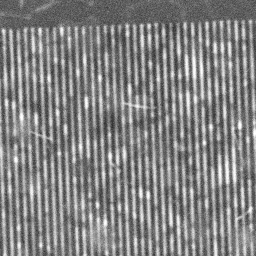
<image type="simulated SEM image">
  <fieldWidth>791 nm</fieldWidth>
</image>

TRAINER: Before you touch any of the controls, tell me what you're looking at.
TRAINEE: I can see parallel lines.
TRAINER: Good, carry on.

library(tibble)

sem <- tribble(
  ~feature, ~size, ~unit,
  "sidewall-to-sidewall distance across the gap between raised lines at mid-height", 15.8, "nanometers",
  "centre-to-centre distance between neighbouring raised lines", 22.5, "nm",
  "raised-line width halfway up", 5.4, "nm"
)